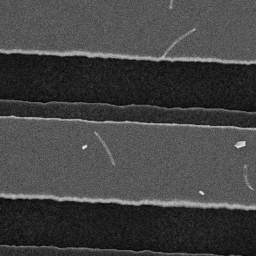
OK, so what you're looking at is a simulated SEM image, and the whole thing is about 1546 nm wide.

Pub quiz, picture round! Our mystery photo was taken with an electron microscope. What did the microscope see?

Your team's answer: lines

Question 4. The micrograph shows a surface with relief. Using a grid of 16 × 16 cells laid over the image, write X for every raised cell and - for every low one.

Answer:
XXXXXXXXXXXXXXXX
XXXXXXXXXXXXXXXX
XXXXXXXXXXXXXXXX
-----XXXXXXXXXXX
----------------
----------------
----------------
XXXXX-----------
XXXXXXXXXXXXXXXX
XXXXXXXXXXXXXXXX
XXXXXXXXXXXXXXXX
XXXXXXXXXXXXXXXX
---XXXXXXXXXXXXX
----------------
----------------
----------------